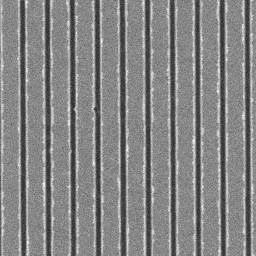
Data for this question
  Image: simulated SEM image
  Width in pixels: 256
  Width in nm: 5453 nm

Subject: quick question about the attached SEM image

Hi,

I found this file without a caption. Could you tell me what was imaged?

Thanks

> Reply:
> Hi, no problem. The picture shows parallel lines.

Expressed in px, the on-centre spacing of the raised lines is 25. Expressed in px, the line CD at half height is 18.6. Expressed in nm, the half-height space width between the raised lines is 128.